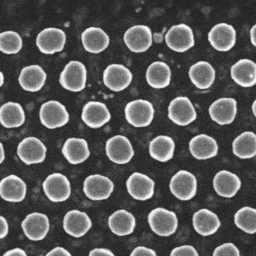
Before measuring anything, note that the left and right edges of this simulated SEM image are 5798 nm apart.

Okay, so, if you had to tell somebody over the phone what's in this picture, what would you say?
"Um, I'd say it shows a regular array of raised bodies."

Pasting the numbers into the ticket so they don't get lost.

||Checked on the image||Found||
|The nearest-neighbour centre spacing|939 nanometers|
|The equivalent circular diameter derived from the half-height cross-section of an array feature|604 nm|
